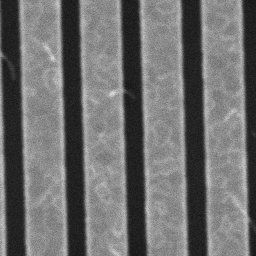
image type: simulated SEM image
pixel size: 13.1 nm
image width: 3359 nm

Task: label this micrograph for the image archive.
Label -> lines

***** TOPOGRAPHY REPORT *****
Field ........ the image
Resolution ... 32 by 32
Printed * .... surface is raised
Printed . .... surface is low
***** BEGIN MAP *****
..******..*****..******..*****..
...*****..*****..******..*****..
...*****..*****...*****..*****..
...*****..*****...*****..*****..
...*****..*****...*****..*****..
...*****..*****...*****..*****..
...*****..*****...*****..*****..
...*****..*****...*****..*****..
...*****..*****...*****..*****..
...*****..*****...*****..*****..
...*****..*****...*****...*****.
...*****..*****...*****...*****.
...*****..*****...*****...*****.
...*****..*****...*****...*****.
...*****..*****...*****...*****.
...*****..*****...*****...*****.
...*****..*****...*****...*****.
...*****...*****..*****...*****.
...*****...*****..*****...*****.
...*****...*****..*****...*****.
...*****...*****..*****...*****.
...*****...*****..*****...*****.
...*****...*****..*****...*****.
*..*****...*****..*****...*****.
*..*****...*****..*****...*****.
*..*****...*****..*****...*****.
*..*****...*****..*****...*****.
*..*****...*****..*****...*****.
*..*****...*****..*****...*****.
*..*****...*****..*****...*****.
*..*****...*****..*****...*****.
*..*****...*****..*****...*****.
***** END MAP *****